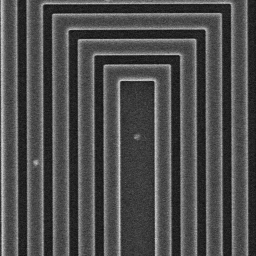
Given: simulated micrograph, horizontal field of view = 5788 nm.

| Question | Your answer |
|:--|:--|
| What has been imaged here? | groups of lines, slits or small figures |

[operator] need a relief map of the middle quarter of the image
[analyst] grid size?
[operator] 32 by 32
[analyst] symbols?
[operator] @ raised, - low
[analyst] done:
@---@@@---@@@@@@@@@@@@@@@@---@@@
@---@@@---@@@@@@@@@@@@@@@@@--@@@
@---@@@---@@@@@@@@@@@@@@@@@--@@@
@---@@@---@@@@@@@@@@@@@@@@@--@@@
@---@@@---@@@@---------@@@@--@@@
@---@@@---@@@@---------@@@@--@@@
@---@@@---@@@@---------@@@@--@@@
@---@@@---@@@@---------@@@@--@@@
@---@@@---@@@@---------@@@@--@@@
@---@@@---@@@@---------@@@@--@@@
@---@@@---@@@@---------@@@@--@@@
@---@@@---@@@@---------@@@@--@@@
@---@@@---@@@@---------@@@@--@@@
@---@@@---@@@@---------@@@@--@@@
@---@@@---@@@@---------@@@@--@@@
@---@@@---@@@@---------@@@@--@@@
@---@@@---@@@@---------@@@@--@@@
@---@@@---@@@@---------@@@@--@@@
@---@@@---@@@@---------@@@@--@@@
@---@@@---@@@@---------@@@@--@@@
@---@@@---@@@@---------@@@@--@@@
@---@@@---@@@@---------@@@@--@@@
@---@@@---@@@@---------@@@@--@@@
@---@@@---@@@@---------@@@@--@@@
@---@@@---@@@@---------@@@@--@@@
@---@@@---@@@@---------@@@@--@@@
@---@@@---@@@@---------@@@@--@@@
@---@@@---@@@@---------@@@@--@@@
@---@@@---@@@@---------@@@@--@@@
@---@@@@--@@@@---------@@@@--@@@
@---@@@@--@@@@---------@@@@--@@@
@---@@@@--@@@@---------@@@@--@@@